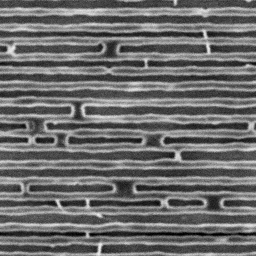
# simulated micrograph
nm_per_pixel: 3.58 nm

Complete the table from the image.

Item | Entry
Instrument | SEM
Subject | parallel lines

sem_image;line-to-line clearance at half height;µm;0.0282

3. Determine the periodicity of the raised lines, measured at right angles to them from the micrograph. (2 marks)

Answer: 54.5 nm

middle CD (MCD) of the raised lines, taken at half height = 28.2 nm